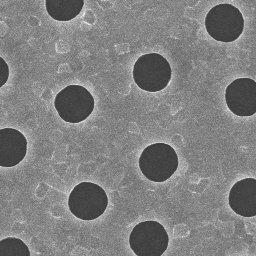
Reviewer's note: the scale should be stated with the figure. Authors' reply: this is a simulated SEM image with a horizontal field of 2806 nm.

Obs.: holes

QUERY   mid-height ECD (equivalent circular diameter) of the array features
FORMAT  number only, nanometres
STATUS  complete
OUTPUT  427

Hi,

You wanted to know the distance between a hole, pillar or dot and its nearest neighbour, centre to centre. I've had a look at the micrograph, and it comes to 920 nm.